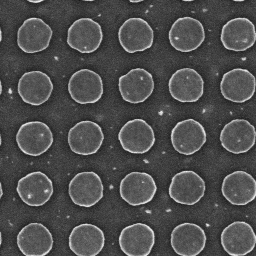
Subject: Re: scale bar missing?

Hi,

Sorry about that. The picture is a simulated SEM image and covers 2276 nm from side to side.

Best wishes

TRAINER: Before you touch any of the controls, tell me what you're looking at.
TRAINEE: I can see a regular array of raised bodies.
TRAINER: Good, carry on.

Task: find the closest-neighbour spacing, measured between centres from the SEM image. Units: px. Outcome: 50.7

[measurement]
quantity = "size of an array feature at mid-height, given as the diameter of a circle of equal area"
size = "0.304 µm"